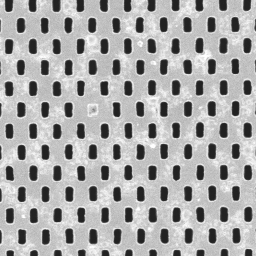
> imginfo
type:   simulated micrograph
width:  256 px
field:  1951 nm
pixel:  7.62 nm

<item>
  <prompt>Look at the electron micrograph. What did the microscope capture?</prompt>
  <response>a regular array of holes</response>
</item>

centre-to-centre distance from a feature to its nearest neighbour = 0.179 micrometres